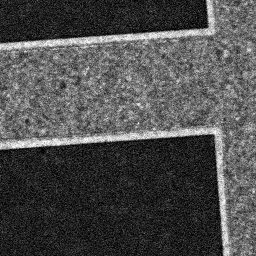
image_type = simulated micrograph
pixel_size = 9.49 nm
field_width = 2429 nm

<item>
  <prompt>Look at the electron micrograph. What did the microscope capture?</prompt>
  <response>one or a few lines or trenches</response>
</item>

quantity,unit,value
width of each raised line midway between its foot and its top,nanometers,936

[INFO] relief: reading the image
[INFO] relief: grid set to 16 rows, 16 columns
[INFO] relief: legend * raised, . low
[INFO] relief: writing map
.............***
.............***
......**********
****************
****************
****************
****************
****************
*********.....**
..............**
..............**
..............**
..............**
..............**
..............**
..............**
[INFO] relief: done